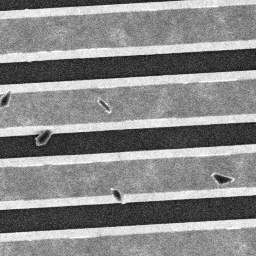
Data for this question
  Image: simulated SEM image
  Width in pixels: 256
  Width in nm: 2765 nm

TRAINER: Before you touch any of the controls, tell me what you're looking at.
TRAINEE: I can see one or a few lines or trenches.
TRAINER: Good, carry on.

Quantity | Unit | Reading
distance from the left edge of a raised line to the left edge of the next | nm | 797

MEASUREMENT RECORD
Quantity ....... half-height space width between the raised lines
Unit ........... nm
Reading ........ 311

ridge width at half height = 485 nm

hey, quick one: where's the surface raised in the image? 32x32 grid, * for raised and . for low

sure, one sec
........................********
.......*************************
********************************
********************************
********************************
********************************
****************................
................................
................................
............................****
..........**********************
********************************
********************************
********************************
********************************
********************............
***..**.........................
.....*..........................
...............................*
................****************
********************************
********************************
********************************
********************************
**********************..........
****............................
................................
................................
....................************
...*****************************
********************************
********************************